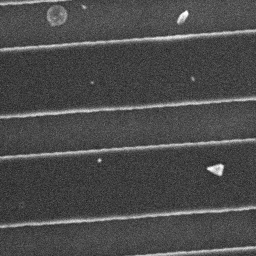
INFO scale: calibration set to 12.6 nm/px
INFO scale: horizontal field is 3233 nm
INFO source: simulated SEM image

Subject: lines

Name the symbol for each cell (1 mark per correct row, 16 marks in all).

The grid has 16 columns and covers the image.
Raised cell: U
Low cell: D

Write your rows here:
DDDDDDDDDDDDDDDD
DDDDDDDDDDDDDDDD
DDDDDDDUUUUUUUUU
UUUUUUUUUUUUUUUU
UUUUUUUUUUUUUUUU
UUUUUUUUUUUUUUUU
UUUUUUUUUUUUDDDD
DDDDDDDDDDDDDDDD
DDDDDDDDDDDDDDDD
DDDDDUUUUUUUUUUU
UUUUUUUUUUUUUUUU
UUUUUUUUUUUUUUUU
UUUUUUUUUUUUUUUU
UUUUUUUUUUDDDDDD
DDDDDDDDDDDDDDDD
DDDDDDDDDDDDDDDU